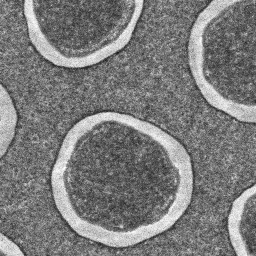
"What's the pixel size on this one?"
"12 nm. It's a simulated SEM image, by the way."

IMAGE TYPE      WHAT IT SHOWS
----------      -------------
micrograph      raised bodies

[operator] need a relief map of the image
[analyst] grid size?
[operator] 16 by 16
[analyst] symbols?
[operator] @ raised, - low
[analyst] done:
--@@@@@@@----@@@
--@@@@@@-----@@@
--@@@@@@----@@@@
---@@@------@@@@
------------@@@@
-------------@@@
--------------@@
------@@--------
-----@@@@@------
----@@@@@@@-----
----@@@@@@@@----
----@@@@@@@@----
----@@@@@@@----@
----@@@@@@@----@
------@@@------@
@--------------@